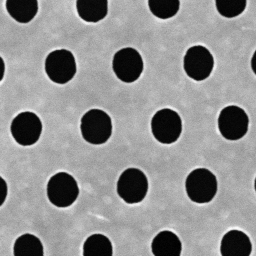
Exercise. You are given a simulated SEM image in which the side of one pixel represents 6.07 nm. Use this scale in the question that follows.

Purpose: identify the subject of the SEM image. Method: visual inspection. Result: a regular array of holes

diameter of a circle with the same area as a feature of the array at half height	33.4	pixels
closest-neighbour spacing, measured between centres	417	nanometres